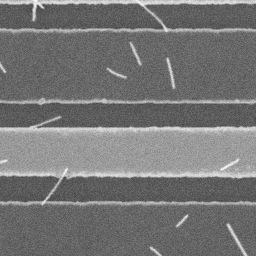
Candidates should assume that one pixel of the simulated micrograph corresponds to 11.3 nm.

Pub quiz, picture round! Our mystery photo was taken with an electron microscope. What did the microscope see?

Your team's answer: lines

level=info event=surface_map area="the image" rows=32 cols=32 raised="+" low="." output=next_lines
....++...........+..............
................................
................................
................................
++++++++++++++++++++++++++++++++
++++++++++++++++++++++++++++++++
++++++++++++++++++++++++++++++++
++++++++++++++++++++++++++++++++
++++++++++++++++++++++++++++++++
++++++++++++++++++++++++++++++++
++++++++++++++++++++++++++++++++
++++++++++++++++++++++++++++++++
++++++++++++++++++++++++++++++++
................................
................................
................................
++++++++++++++++++++++++++++++++
++++++++++++++++++++++++++++++++
++++++++++++++++++++++++++++++++
++++++++++++++++++++++++++++++++
++++++++++++++++++++++++++++++++
++++++++++++++++++++++++++++++++
................................
................................
................................
++++++++++++++++++++++++++++++++
++++++++++++++++++++++++++++++++
++++++++++++++++++++++++++++++++
++++++++++++++++++++++++++++++++
++++++++++++++++++++++++++++++++
++++++++++++++++++++++++++++++++
++++++++++++++++++++++++++++++++